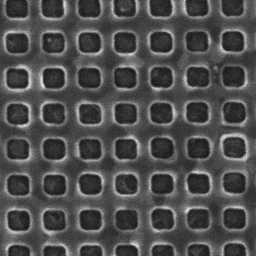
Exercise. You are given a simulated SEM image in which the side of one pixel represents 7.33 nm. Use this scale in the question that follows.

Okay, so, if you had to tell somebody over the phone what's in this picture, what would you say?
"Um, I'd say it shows a regular array of holes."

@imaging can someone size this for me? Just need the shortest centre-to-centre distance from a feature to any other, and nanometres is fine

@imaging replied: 258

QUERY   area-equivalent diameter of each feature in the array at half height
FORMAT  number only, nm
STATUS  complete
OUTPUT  174